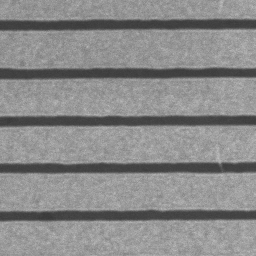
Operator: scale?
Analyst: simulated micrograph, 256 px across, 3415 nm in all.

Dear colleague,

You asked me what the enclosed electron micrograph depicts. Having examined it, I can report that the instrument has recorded lines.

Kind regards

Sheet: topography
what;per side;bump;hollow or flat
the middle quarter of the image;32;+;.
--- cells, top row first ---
++++++++++++++++++++++++++++++++
................................
................................
................................
++++++++++++++++++++++++++++++++
++++++++++++++++++++++++++++++++
++++++++++++++++++++++++++++++++
++++++++++++++++++++++++++++++++
++++++++++++++++++++++++++++++++
++++++++++++++++++++++++++++++++
++++++++++++++++++++++++++++++++
++++++++++++++++++++++++++++++++
++++++++++++++++++++++++++++++++
................................
................................
................................
++++++++++++++++++++++++++++++++
++++++++++++++++++++++++++++++++
++++++++++++++++++++++++++++++++
++++++++++++++++++++++++++++++++
++++++++++++++++++++++++++++++++
++++++++++++++++++++++++++++++++
++++++++++++++++++++++++++++++++
++++++++++++++++++++++++++++++++
+++++++++++++++++++++++++++++.+.
................................
................................
+++.+++.........+++++.++++++++++
++++++++++++++++++++++++++++++++
++++++++++++++++++++++++++++++++
++++++++++++++++++++++++++++++++
++++++++++++++++++++++++++++++++